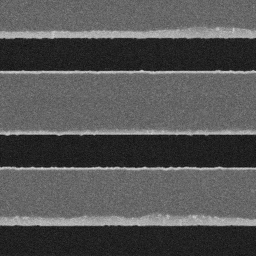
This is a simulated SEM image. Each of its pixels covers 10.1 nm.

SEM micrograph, lines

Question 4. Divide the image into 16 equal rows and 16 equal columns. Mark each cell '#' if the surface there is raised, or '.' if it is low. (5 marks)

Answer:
################
################
................
................
################
################
################
################
................
................
#..##.#.........
################
################
################
................
................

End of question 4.